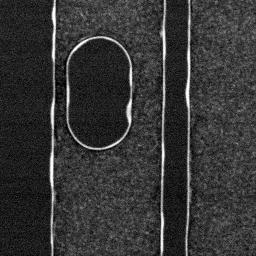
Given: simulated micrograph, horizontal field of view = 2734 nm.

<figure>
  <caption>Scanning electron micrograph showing groups of lines, slits or small figures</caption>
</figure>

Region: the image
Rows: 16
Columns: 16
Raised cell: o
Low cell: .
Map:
ooo.......oo....
ooo.......oo....
ooo..oo...oo....
ooo.oooo..oo....
ooo.oooo..oo....
ooo.oooo..oo....
ooo.oooo..oo....
ooo.oooo..oo....
ooo..ooo..oo....
ooo.......oo....
ooo.......oo....
ooo.......oo....
ooo.......oo....
ooo.......oo....
ooo.......oo....
ooo.......oo....